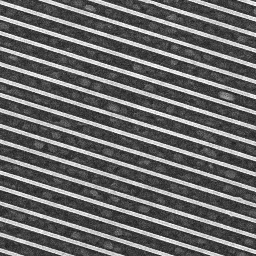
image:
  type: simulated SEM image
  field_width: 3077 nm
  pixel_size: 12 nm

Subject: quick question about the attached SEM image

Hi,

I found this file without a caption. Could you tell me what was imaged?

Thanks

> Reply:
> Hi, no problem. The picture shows parallel lines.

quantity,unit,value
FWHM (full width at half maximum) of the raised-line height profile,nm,41.6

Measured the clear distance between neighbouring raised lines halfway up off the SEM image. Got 138 nanometres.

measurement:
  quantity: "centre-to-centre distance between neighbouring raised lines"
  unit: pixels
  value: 14.8